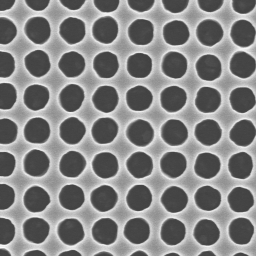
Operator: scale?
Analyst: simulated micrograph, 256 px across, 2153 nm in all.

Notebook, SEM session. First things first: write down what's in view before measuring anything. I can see a regular array of holes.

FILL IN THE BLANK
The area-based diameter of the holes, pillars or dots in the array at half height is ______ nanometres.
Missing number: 219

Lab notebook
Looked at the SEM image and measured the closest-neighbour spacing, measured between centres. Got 0.273 microns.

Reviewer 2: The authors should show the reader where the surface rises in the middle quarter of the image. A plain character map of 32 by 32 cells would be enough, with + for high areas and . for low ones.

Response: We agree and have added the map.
.....++.......++......++.......+
.....+++.....+++......+++......+
....++++.....+++.....++++.....++
++++++++++..++++++..+++++++..+++
++++++++++++++++++++++++++++++++
+...++++++.+++++++.++++++++.++++
....++++.....+++.....++++.....++
.....++......++.......++......++
.....++.......+.......++.......+
.....++......++.......++......++
....++++.....+++.....+++......++
...++++++...+++++...+++++....+++
++++++++++++++++++++++++++++++++
+..++++++..+++++++++++++++++++++
....++++.....++++....+++++...+++
.....++......+++......+++.....++
.....++......+++......++.......+
.....++......+++......++.......+
.....++......+++......+++......+
...+++++....+++++....++++.....++
++++++++++++++++++..++++++++++++
++++++++++++++++++++++++++++++++
....++++....+++++...++++++....++
.....+++.....+++......++......++
.....++......+++......++.......+
.....++.......++......++.......+
.....++......+++......++......++
....++++.....++++....+++++...+++
++++++++++.+++++++.+++++++++++++
++++++++++++++++++++++++++++++++
...++++++..+++++++..++++++++++++
.....++.....++++.....+++++....++